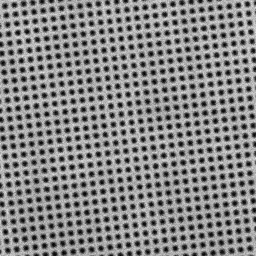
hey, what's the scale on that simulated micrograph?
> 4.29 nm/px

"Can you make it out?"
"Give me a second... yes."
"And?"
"a regular array of holes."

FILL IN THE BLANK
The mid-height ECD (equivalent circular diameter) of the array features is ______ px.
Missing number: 6.57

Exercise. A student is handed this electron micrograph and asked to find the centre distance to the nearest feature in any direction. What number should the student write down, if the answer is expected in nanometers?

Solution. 39.1